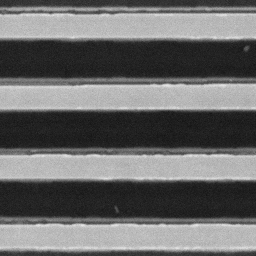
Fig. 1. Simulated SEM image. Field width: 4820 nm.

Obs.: lines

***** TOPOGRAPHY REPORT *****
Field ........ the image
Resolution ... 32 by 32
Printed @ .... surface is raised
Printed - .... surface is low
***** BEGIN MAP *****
--------------------------------
@@@@@@@@@@@@@@@@@@@@@@@@@@@@@@@@
@@@@@@@@@@@@@@@@@@@@@@@@@@@@@@@@
@@@@@@@@@@@@@@@@@@@@@@@@@@@@@@@@
@@@@@@@@@@@@@@@@@@@@@@@@@@@@@@@@
--------------------------------
--------------------------------
--------------------------------
--------------------------------
--------------------------------
@@@@@@@@@@@@@@@@@@@@@@@@@@@@@@@@
@@@@@@@@@@@@@@@@@@@@@@@@@@@@@@@@
@@@@@@@@@@@@@@@@@@@@@@@@@@@@@@@@
@@@@@@@@@@@@@@@@@@@@@@@@@@@@@@@@
--------------------------------
--------------------------------
--------------------------------
--------------------------------
--------------------------------
@@@@@@@@@@@@@@@@@@@@@@@@@@@@@@@@
@@@@@@@@@@@@@@@@@@@@@@@@@@@@@@@@
@@@@@@@@@@@@@@@@@@@@@@@@@@@@@@@@
--------------------------------
--------------------------------
--------------------------------
--------------------------------
--------------------------------
--------------------------------
@@@@@@@@@@@@@@@@@@@@@@@@@@@@@@@@
@@@@@@@@@@@@@@@@@@@@@@@@@@@@@@@@
@@@@@@@@@@@@@@@@@@@@@@@@@@@@@@@@
--------------------------------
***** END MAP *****